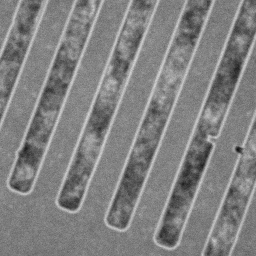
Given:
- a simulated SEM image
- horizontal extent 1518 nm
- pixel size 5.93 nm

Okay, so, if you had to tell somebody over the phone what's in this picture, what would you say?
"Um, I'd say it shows parallel lines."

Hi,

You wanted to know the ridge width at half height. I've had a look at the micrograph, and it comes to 161 nanometres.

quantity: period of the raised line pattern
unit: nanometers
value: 308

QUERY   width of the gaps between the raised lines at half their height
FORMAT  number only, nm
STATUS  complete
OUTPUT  145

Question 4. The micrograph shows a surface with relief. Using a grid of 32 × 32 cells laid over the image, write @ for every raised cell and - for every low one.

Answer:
@@----@@@----@@@----@@@---@@@@--
@@---@@@@---@@@@---@@@@---@@@@--
@@---@@@@---@@@@---@@@----@@@---
@----@@@----@@@---@@@@---@@@@---
@---@@@@---@@@@---@@@@---@@@@---
@---@@@----@@@----@@@----@@@----
---@@@@---@@@@---@@@@---@@@@---@
---@@@@---@@@@---@@@@---@@@----@
---@@@----@@@----@@@---@@@@---@@
--@@@@---@@@@---@@@@---@@@@---@@
--@@@@---@@@@---@@@----@@@----@@
--@@@---@@@@---@@@@---@@@@---@@@
-@@@@---@@@@---@@@@---@@@@---@@@
-@@@----@@@----@@@----@@@----@@@
@@@@---@@@@---@@@@---@@@@---@@@@
@@@@---@@@@---@@@@---@@@----@@@-
@@@----@@@---@@@@---@@@@---@@@@-
@@@---@@@@---@@@@---@@@@--@@@@@-
@@@---@@@@---@@@----@@@----@@---
@@---@@@@---@@@@---@@@@---@@@@--
@@---@@@@---@@@@---@@@@---@@@@--
@----@@@----@@@----@@@----@@@---
@---@@@@---@@@@---@@@@---@@@@---
@---@@@@---@@@@---@@@@---@@@----
@@@@@@@----@@@---@@@@---@@@@---@
@@@@@@@---@@@@---@@@@---@@@@---@
@@@@@@@@@@@@@----@@@----@@@----@
@@@@@@@@@@@@@---@@@@---@@@@---@@
@@@@@@@@@@@@@@--@@@@---@@@@---@@
@@@@@@@@@@@@@@@@@@@----@@@----@@
@@@@@@@@@@@@@@@@@@@@--@@@@---@@@
@@@@@@@@@@@@@@@@@@@@@@@@@----@@@